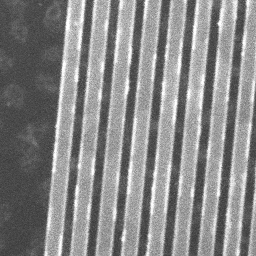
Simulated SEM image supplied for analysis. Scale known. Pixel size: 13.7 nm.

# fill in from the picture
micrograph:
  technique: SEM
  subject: parallel lines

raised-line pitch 25.3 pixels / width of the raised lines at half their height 211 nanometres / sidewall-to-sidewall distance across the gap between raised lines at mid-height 134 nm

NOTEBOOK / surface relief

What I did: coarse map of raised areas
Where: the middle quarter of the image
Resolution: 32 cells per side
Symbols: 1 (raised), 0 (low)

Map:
11100011110001110001111001111000
11100011110001110001110001111000
11100011110001110001110001111000
11100011100011110001110001111000
11100011100011110001110001110001
11100011100011110001110001110001
11100011100011110011110001110001
11100011100011110011110001110001
11100111100011100011110001110001
11100111100011100011110011110001
11100111100011100011110011110001
11000111100011100011100011110001
11000111100011100011100011110001
11000111000111100011100011110001
11000111000111100011100011100001
11000111000111100011100011100011
11000111000111100011100011100011
11000111000111100111100011100011
11000111000111000111100011100011
11001111000111000111100011100011
10001111000111000111100111100011
10001111000111000111100111100011
10001111000111000111000111100011
10001111000111000111000111100011
10101111001111000111000111100011
10101110001111000111000111000111
10001110001111001111000111000111
10001110001111001111000111000111
10001110001111001111000111000111
10011110001110001111001111000111
10011110001110001111001111000111
00011110001110001111001111000111